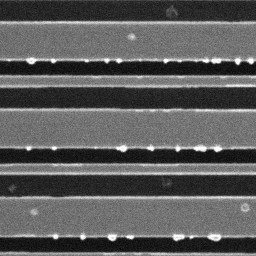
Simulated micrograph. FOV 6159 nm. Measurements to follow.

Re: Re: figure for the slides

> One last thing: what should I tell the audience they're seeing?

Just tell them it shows lines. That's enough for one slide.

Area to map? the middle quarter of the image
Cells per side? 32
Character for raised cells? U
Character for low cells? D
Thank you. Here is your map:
DDDDDDDDDDDDDDDDDDDDDDDDDDDDDDDD
DDDDDDDDDDDDDDDDDDDDDDDDDDDDDDDD
DDDDDDDDDDDDDDDDDDDDDDDDDDDDDDDD
UUUUUUUUUUUUUUUUUUUUUUUUUUUUUUUU
UUUUUUUUUUUUUUUUUUUUUUUUUUUUUUUU
UUUUUUUUUUUUUUUUUUUUUUUUUUUUUUUU
DDDDDDDDDDDDDDDDDDDDDDDDDDDDDDDD
DDDDDDDDDDDDDDDDDDDDDDDDDDDDDDDD
DDDDDDDDDDDDDDDDDDDDDDDDDDDDDDDD
DDDDDDDDDDDDDDDDDDDDDDDDDDDDDDDD
DDDDDDDDDDDDDDDDDDDDDDDDDDDDDDDD
UUUUUUUUUUUUUUUUUUUUUUUUUUUUUUUU
UUUUUUUUUUUUUUUUUUUUUUUUUUUUUUUU
UUUUUUUUUUUUUUUUUUUUUUUUUUUUUUUU
UUUUUUUUUUUUUUUUUUUUUUUUUUUUUUUU
UUUUUUUUUUUUUUUUUUUUUUUUUUUUUUUU
UUUUUUUUUUUUUUUUUUUUUUUUUUUUUUUU
UUUUUUUUUUUUUUUUUUUUUUUUUUUUUUUU
UUUUUUUUUUUUUUUUUUUUUUUUUUUUUUUU
UUUUUUUUUUUUUUUUUUUUUUUUUUUUUUUU
UUUUUUUUUUUUUUUUUUUUUUUUUUUUUUUU
DDDDDDDDDDDDDDUUDDDDDUDDDDDDUDDD
DDDDDDDDDDDDDDDDDDDDDDDDDDDDDDDD
DDDDDDDDDDDDDDDDDDDDDDDDDDDDDDDD
DDDDDDDDDDDDDDDDDDDDDDDDDDDDDDDD
UUUUUUUUUUUUUUUUUUUUUUUUUUUUUUUU
UUUUUUUUUUUUUUUUUUUUUUUUUUUUUUUU
DUUUUDDDDDDDDDDUDDUUUUUUUUUUUUUU
DDDDDDDDDDDDDDDDDDDDDDDDDDDDDDDD
DDDDDDDDDDDDDDDDDDDDDDDDDDDDDDDD
DDDDDDDDDDDDDDDDDDDDDDDDDDDDDDDD
DDDDDDDDDDDDDDDDDDDDDDDDDDDDDDDD